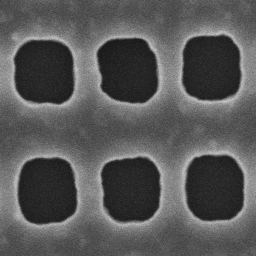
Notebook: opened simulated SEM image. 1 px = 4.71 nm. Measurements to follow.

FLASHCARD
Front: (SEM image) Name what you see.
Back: holes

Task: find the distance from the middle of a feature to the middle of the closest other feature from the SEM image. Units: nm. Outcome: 394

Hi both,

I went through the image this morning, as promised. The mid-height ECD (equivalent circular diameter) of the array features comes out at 311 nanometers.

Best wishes